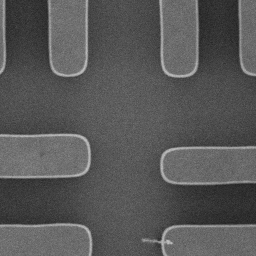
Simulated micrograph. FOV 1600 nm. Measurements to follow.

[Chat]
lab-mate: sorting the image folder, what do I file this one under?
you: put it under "groups of lines, slits or small figures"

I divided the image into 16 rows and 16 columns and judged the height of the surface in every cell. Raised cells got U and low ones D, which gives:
DDDUUDDDDDUUDDDU
DDDUUDDDDDUUDDDU
DDDUUDDDDDUUDDDU
DDDUUDDDDDUUDDDU
DDDDUDDDDDUUDDDU
DDDDDDDDDDDDDDDD
DDDDDDDDDDDDDDDD
DDDDDDDDDDDDDDDD
UUUUUDDDDDDDDDDD
UUUUUUDDDDUUUUUU
UUUUUDDDDDUUUUUU
DDDDDDDDDDDDDDDD
DDDDDDDDDDDDDDDD
DDDDDDDDDDDDDDDD
UUUUUDDDDDUUUUUU
UUUUUUDDDDUUUUUU